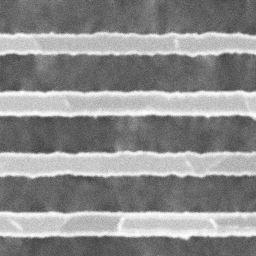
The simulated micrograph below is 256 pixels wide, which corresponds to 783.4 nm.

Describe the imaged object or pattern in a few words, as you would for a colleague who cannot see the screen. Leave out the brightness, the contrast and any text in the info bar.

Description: lines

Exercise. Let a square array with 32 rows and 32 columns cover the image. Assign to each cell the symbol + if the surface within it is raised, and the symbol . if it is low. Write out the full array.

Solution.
................................
................................
................................
................................
+++++++++++++++++++++++++++++++.
++++++++++++++++++++++++++++++++
++++++++++++++++++++++++++++++++
................................
................................
................................
................................
.............................+..
++++++++++++++++++++++++++++++++
++++++++++++++++++++++++++++++++
................................
................................
................................
................................
................................
++++++++++++++++++++++++++++++++
++++++++++++++++++++++++++++++++
++++++++++++++++++++++++++++++++
................................
................................
................................
................................
................................
++++++++++++++++++++++++++++++++
++++++++++++++++++++++++++++++++
................................
................................
................................